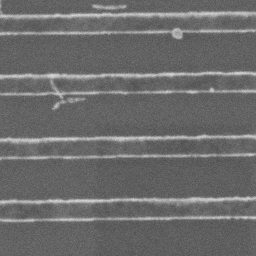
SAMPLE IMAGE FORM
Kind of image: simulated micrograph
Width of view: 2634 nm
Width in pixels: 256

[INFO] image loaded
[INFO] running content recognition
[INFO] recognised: lines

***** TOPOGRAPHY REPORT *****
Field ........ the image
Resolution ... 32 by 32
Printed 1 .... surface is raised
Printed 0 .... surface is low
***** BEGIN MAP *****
00000000000000000000000000000000
00000000000000000000000000000000
11111111111111111111111111111111
11111111111111111111111111111111
00000000000000000000001000000000
00000000000000000000000000000000
00000000000000000000000000000000
00000000000000000000000000000000
00000000000000000000000000000000
00011111000111111111111111111111
11111111111111111111111111111111
11111111111111111111100010000000
00000000000000000000000000000000
00000000000000000000000000000000
00000000000000000000000000000000
00000000000000000000000000000000
00000000000000000000000000000000
01000111111111111111111111111111
11111111111111111111111111111111
11111111111111111111111100000000
00000000000000000000000000000000
00000000000000000000000000000000
00000000000000000000000000000000
00000000000000000000000000000000
00000000000000000000000000000000
11111111111111111111111111111111
11111111111111111111111111111111
01111000000000000000000000000000
00000000000000000000000000000000
00000000000000000000000000000000
00000000000000000000000000000000
00000000000000000000000000000000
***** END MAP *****